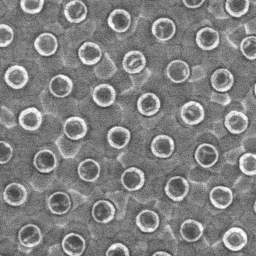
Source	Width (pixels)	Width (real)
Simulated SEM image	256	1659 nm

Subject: a regular array of raised bodies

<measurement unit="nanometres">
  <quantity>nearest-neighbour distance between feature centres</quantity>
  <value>285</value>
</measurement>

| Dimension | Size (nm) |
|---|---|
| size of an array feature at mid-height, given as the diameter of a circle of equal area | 142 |